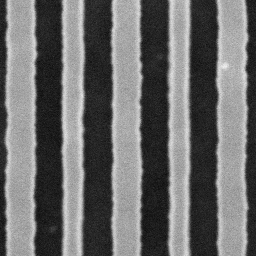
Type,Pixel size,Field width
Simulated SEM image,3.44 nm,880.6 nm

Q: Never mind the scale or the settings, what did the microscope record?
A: lines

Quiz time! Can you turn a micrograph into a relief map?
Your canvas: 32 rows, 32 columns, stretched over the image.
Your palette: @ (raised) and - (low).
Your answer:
-@@@----@@----@@@@---@@@---@@@@-
-@@@----@@----@@@@---@@@---@@@@-
-@@@----@@----@@@----@@@---@@@@-
-@@@----@@----@@@----@@@---@@@@-
-@@@----@@----@@@@---@@@---@@@@-
-@@@----@@----@@@@---@@@---@@@@-
-@@@@---@@----@@@@---@@@---@@@@-
-@@@----@@----@@@@---@@@---@@@@-
-@@@----@@----@@@@---@@@---@@@@-
-@@@----@@----@@@@---@@@---@@@@-
-@@@----@@----@@@@---@@@---@@@@-
-@@@----@@----@@@@---@@@---@@@@-
-@@@----@@----@@@----@@@---@@@@-
-@@@----@@----@@@@---@@@---@@@@-
-@@@----@@----@@@@---@@@---@@@@-
-@@@----@@----@@@@---@@@---@@@@-
-@@@----@@----@@@----@@@---@@@@-
-@@@----@@----@@@@---@@@---@@@@-
-@@@----@@----@@@@---@@@---@@@@-
-@@@----@@----@@@@---@@@---@@@@-
-@@@----@@----@@@@---@@@---@@@@-
-@@@----@@----@@@@---@@@---@@@@-
-@@@----@@----@@@@---@@@---@@@@-
-@@@----@@----@@@@---@@@---@@@@-
-@@@----@@----@@@@---@@@---@@@@-
-@@@----@@----@@@@---@@@---@@@@-
-@@@----@@----@@@@---@@@---@@@@-
-@@@----@@----@@@@---@@@---@@@@-
-@@@----@@----@@@@---@@@---@@@@-
-@@@----@@----@@@@---@@@---@@@@-
-@@@----@@----@@@@---@@@---@@@@-
-@@@----@@----@@@@---@@@---@@@@-